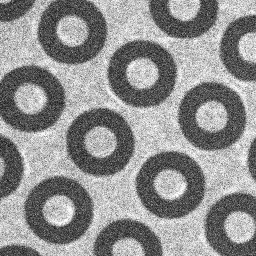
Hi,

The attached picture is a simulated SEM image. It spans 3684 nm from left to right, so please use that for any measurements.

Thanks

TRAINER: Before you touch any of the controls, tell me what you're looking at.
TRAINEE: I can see ring-shaped grooves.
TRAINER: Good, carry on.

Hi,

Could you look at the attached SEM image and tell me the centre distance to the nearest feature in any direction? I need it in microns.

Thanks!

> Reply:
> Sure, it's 1.15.